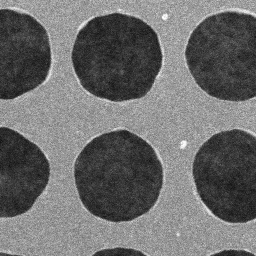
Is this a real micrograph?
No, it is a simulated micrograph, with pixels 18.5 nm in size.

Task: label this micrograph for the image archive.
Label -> holes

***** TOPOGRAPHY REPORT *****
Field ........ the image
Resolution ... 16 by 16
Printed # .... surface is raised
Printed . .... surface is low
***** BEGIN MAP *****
################
...##....###....
...##.....##....
...#......##....
...##.....##....
..###....####...
################
################
.#####...####...
...##.....##....
...##.....##....
...##.....##....
..###.....###...
.#####...#####..
################
#######.########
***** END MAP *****